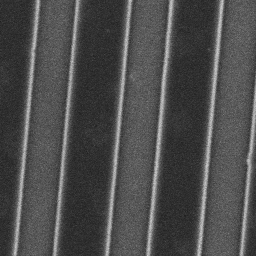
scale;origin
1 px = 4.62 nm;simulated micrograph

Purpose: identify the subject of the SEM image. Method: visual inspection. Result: one or a few lines or trenches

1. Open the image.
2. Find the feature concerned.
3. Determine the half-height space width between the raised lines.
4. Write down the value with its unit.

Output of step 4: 184 nm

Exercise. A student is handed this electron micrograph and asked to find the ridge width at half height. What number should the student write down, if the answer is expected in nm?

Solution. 244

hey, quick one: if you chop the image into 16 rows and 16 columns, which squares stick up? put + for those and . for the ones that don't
++...+++...+++..
++...+++...+++..
++...+++..++++..
++...+++..++++..
++..++++..+++...
++..++++..+++...
++..++++..+++...
++..+++...+++...
++..+++...+++...
++..+++...+++...
+...+++...+++...
+...+++...+++..+
+...+++...+++..+
+...+++..++++..+
+...+++..++++..+
+..++++..+++...+